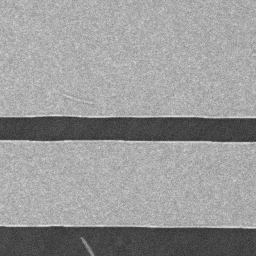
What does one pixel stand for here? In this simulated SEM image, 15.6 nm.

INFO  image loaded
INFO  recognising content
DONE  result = wiring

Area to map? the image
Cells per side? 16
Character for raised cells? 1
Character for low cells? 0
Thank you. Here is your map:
1111111111111111
1111111111111111
1111111111111111
1111111111111111
1111111111111111
1111111111111111
1111111111111111
0000000000000000
0000000000000000
1111111111111111
1111111111111111
1111111111111111
1111111111111111
1111111111111111
0000000000000000
0000000000000000